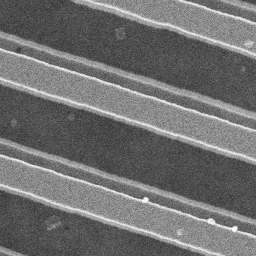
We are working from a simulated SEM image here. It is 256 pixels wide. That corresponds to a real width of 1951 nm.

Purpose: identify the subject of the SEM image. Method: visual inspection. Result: lines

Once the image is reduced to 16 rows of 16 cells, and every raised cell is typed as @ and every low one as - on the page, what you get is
-------@@@@@@@@@
----------@@@@@@
@------------@@@
@@@@------------
@@@@@@@---------
--@@@@@@@@------
-----@@@@@@@@---
--------@@@@@@@@
-----------@@@@@
@@------------@@
@@@@@-----------
@@@@@@@@--------
---@@@@@@@@-----
------@@@@@@@@@-
---------@@@@@@@
------------@@@@